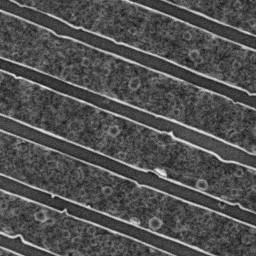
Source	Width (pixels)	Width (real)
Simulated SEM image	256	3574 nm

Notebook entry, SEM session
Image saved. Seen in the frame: parallel lines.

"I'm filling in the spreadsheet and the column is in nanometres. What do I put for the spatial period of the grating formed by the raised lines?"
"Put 771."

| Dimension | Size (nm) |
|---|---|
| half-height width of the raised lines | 585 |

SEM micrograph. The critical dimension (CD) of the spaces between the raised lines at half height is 179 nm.